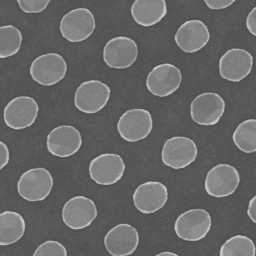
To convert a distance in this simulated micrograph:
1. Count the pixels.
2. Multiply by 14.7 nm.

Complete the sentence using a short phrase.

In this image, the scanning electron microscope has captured a regular array of raised bodies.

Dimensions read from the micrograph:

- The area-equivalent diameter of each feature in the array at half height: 483 nm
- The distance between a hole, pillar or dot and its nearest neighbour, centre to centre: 0.754 micrometres